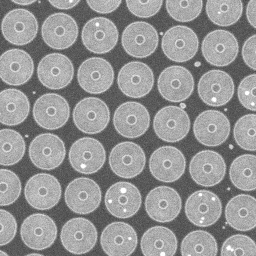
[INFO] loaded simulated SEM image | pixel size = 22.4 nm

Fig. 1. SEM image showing an array of small figures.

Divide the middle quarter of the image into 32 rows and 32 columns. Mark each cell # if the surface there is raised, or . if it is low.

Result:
..##.......####.....############
..##........##........####.....#
..##...##...##........##.......#
..##...##...##...##...##........
.###........##...##...##...##...
#####......###........##...##...
######....#####......###........
################....####.......#
##########################....##
####......######################
.##.......####.....#############
.##........##.......####.....###
.##...##...##........##.......##
.##...##...##...##...##........#
###........##...##...##...##...#
###.......###........##...##...#
#####....####.......###........#
##############.....####.......##
########################.....###
###.....########################
##.......####.....##############
##........##.......####.....####
#....##...##........##.......###
##...##...#....##...##........##
##........##...##...##...##...##
##..#....###........##...##...##
###.....####.......###........##
#############.....####.......###
#######################.....####
##.....#########################
#.......####.....###############
#........##...#...####.....#####